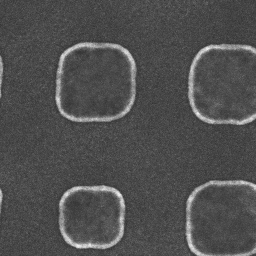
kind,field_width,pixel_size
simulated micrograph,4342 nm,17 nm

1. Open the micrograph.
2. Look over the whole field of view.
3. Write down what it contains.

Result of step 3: raised bodies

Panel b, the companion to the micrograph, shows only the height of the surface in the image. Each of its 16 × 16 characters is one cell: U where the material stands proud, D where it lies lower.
DDDDDDDDDDDDDDDD
DDDDDDDDDDDDDDDD
DDDDDDDDDDDDDDDD
DDDDUUUUDDDDUUUU
DDDDUUUUDDDDUUUU
DDDDUUUUDDDDUUUU
DDDDUUUUDDDDUUUU
DDDDDUDDDDDDDUUU
DDDDDDDDDDDDDDDD
DDDDDDDDDDDDDDDD
DDDDDDDDDDDDDDDD
DDDDDDDDDDDDDUUU
DDDDUUUUDDDDUUUU
DDDDUUUUDDDDUUUU
DDDDUUUUDDDDUUUU
DDDDDDDDDDDDUUUU